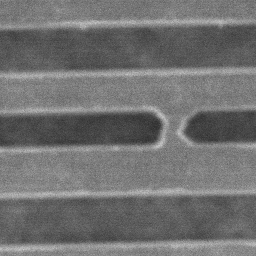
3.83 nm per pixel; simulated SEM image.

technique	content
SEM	one or a few lines or trenches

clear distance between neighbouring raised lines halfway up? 170 nm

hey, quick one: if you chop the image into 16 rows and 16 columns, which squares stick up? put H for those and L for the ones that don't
HHHHHHHHHHHHHHHH
HHHHHHHHHHHHHHLL
LLLLLLLLLLLLLLLL
LLLLLLLLLLLLLLLL
LLLLHHHHHHHHHHHH
HHHHHHHHHHHHHHHH
HHHHHHHHHHHHHHHH
LLLLLLLLLLHHLLLL
LLLLLLLLLLHHLLLL
HHHHHHHHHHHHHHHH
HHHHHHHHHHHHHHHH
HHHHHHHHHHHHHHHH
LLLLLLLLLLLLLLLL
LLLLLLLLLLLLLLLL
LLLLLLLLLLLLLLLL
HHHHHHHHHHHHHHHH